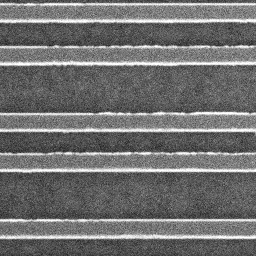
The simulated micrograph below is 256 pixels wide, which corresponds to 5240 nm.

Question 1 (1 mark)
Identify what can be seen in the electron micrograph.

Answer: lines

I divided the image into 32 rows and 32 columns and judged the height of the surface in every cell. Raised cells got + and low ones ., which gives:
................................
++++++++++++++++++++++++++++++++
++++++++++++++++++++++++++++++++
................................
................................
................................
++++++++++++++++++++++++++++++++
++++++++++++++++++++++++++++++++
................................
................................
................................
................................
................................
................................
++++++++++++++++++++++++++++++++
++++++++++++++++++++++++++++++++
................................
................................
................................
++++++++++++++++++++++++++++++++
++++++++++++++++++++++++++++++++
................................
................................
................................
................................
................................
................................
................................
++++++++++++++++++++++++++++++++
++++++++++++++++++++++++++++++++
................................
................................